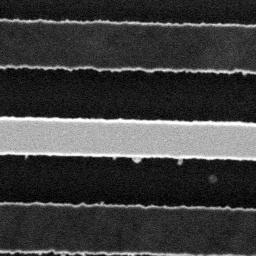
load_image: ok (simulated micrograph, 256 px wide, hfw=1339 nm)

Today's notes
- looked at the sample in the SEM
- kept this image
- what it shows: lines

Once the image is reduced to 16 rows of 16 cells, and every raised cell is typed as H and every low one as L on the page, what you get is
LLLLLLLLLLLLLLLL
HHHHHHHHHHHLLLLL
HHHHHHHHHHHHHHHH
HHHHHHHHHHHHHHHH
LLLLLLLLLLLLHHHH
LLLLLLLLLLLLLLLL
LLLLLLLLLLLLLLLL
HHHHHHLLLLLLLLLL
HHHHHHHHHHHHHHHH
HHHHHHHHHHHHHHHH
LLLLLLLLLLLLLLLL
LLLLLLLLLLLLLLLL
LLLLLLLLLLLLLLLL
HHHHHHHHHHHHHHHH
HHHHHHHHHHHHHHHH
HHHHHHHHHHHHHHHH